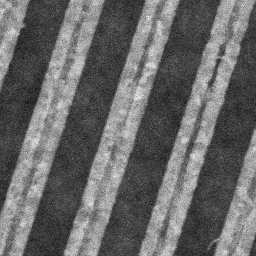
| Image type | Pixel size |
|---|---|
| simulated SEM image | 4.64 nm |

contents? one or a few lines or trenches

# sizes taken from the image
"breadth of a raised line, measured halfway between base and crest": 95.5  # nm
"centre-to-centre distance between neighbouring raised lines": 334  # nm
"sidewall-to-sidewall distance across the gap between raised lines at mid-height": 238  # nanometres